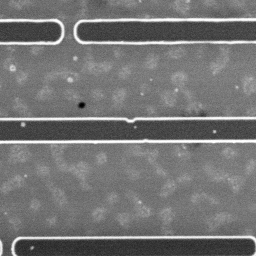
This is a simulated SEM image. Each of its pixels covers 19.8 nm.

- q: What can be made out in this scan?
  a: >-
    one or a few lines or trenches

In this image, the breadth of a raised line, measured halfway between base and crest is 461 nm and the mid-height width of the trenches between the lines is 1600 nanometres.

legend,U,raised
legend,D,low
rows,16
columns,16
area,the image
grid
DDDDDDDDDDDDDDDD
UUUUDUUUUUUUUUUU
UUUUDUUUUUUUUUUU
DDDDDDDDDDDDDDDD
DDDDDDDDDDDDDDDD
DDDDDDDDDDDDDDDD
DDDDDDDDDDDDDDDD
UUUUUUUUUUUUUUUU
UUUUUUUUUUUUUUUU
DDDDDDDDDDDDDDDD
DDDDDDDDDDDDDDDD
DDDDDDDDDDDDDDDD
DDDDDDDDDDDDDDDD
DDDDDDDDDDDDDDDD
DDDDDDDDDDDDDDDD
DUUUUUUUUUUUUUUU